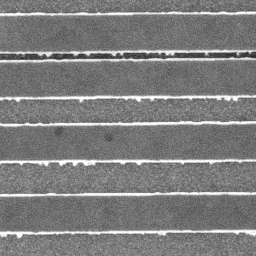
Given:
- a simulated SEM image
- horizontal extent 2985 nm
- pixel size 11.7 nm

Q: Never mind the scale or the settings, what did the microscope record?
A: lines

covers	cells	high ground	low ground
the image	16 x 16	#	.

................
################
################
################
################
################
................
................
################
################
................
................
################
################
##########......
................